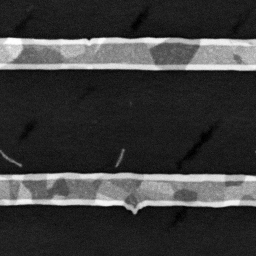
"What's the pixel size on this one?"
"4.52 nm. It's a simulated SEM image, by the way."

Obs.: one or a few lines or trenches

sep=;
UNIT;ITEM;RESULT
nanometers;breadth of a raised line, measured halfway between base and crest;116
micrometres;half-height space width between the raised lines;0.499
